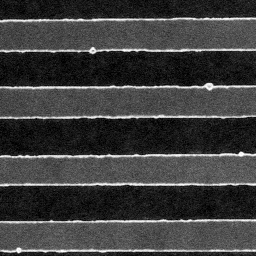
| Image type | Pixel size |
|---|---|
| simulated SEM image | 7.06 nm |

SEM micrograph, lines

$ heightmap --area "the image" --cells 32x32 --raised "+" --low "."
................................
................................
........+.+.++++++++++++++++++++
++++++++++++++++++++++++++++++++
++++++++++++++++++++++++++++++++
++++++++++++++++++++++++++++++++
...........+....................
................................
................................
................................
................................
++++++++++++++++++++++++++++++++
++++++++++++++++++++++++++++++++
++++++++++++++++++++++++++++++++
++++++++++++++++++++++++++++++++
................................
................................
................................
................................
++.+++++++++++++++++++++++++++++
++++++++++++++++++++++++++++++++
++++++++++++++++++++++++++++++++
++++++++++++++++++++++++++++++++
................................
................................
................................
................................
................................
++++++++++++++++++++++++++++++++
++++++++++++++++++++++++++++++++
++++++++++++++++++++++++++++++++
................................